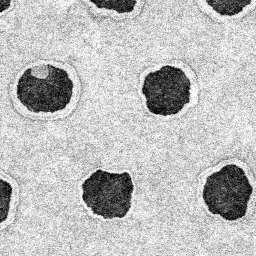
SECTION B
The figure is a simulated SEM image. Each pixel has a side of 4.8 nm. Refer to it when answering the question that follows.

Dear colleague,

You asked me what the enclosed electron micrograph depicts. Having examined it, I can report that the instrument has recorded holes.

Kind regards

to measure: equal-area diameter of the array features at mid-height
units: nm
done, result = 253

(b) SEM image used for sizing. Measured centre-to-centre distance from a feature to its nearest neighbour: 570 nm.